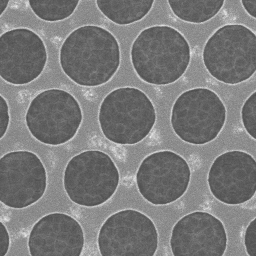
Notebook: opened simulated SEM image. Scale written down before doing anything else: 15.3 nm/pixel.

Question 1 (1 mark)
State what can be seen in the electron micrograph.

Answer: holes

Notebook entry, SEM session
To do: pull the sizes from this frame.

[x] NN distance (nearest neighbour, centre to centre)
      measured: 1080 nanometers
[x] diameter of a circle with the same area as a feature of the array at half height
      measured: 845 nanometres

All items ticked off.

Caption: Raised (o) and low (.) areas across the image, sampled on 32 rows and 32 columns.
.ooo......oo.......oo.......oo..
oooo.....oooo......ooo.....oooo.
oooooo..oooooo...oooooo...oooooo
oooooooooo...oooooo..ooooooo...o
.....oooo.....ooo......oooo.....
.....ooo.......oo.......oo......
......oo.......o........o.......
......o........oo.......o.......
.....ooo.......oo......ooo......
.....oooo.....ooo......oooo....o
oo.ooooooo...oooooo..ooooooooooo
ooooo...oooooo....ooooo....ooooo
.ooo.....oooo......ooo......ooo.
.ooo......ooo......ooo......oo..
.oo.......oo.......oo.......oo..
.oo.......ooo......oo.......oo..
.ooo......ooo......ooo.....oooo.
ooooo....ooooo....ooooo...oooooo
oooooooooooooooooooooooooooooooo
.....oooo.....ooooo...ooooo....o
.....ooo......oooo.....oooo.....
......oo.......oo.......oo......
......oo.......oo.......oo......
......oo.......oo......ooo......
.....oooo.....oooo.....oooo.....
o...oooooo...oooooo.ooooooooo.oo
ooooooooooooooo..ooooooo..oooooo
ooooo....oooo......ooo.....ooooo
.ooo......ooo......ooo......ooo.
.ooo......oo........o.......ooo.
.ooo......oo........o.......ooo.
.ooo......ooo......ooo......ooo.